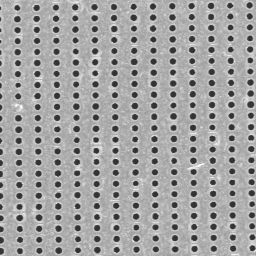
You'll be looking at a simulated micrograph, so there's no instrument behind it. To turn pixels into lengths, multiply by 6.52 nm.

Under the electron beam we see a regular array of holes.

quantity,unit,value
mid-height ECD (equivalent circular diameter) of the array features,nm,38.2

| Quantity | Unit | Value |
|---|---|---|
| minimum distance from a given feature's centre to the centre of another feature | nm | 71.6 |